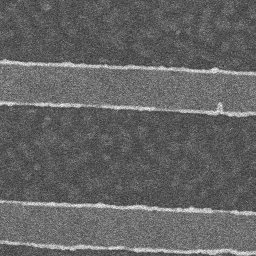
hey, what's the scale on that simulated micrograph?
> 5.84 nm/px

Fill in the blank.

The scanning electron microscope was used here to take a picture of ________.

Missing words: one or a few lines or trenches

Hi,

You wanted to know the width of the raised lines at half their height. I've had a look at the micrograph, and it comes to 261 nm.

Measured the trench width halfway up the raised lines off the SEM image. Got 0.561 micrometres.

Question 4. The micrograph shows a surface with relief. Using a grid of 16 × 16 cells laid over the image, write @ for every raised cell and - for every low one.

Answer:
----------------
----------------
----------------
----------------
@@@@@@@@@@@@@@@-
@@@@@@@@@@@@@@@@
@@@@@@@@@@@@@@@@
----------------
----------------
----------------
----------------
----------------
----------------
@@@@@@@@@@@@@@@@
@@@@@@@@@@@@@@@@
---@@@@@@@@@@@@@